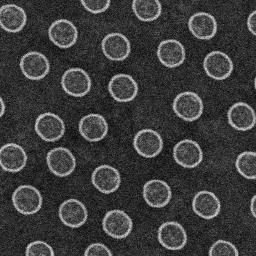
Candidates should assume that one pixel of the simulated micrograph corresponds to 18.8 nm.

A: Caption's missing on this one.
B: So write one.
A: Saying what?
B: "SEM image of a regular array of raised bodies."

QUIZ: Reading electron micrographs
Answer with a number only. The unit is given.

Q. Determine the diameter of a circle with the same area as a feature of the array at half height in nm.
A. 492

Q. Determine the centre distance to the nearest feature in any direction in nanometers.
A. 810